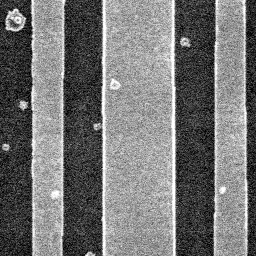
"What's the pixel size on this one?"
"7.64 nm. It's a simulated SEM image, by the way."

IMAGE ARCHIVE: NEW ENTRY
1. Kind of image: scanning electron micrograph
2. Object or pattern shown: lines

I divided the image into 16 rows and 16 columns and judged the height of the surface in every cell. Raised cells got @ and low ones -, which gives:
--@@--@@@@@---@-
--@@---@@@@---@-
--@@---@@@@--@@-
--@@--@@@@@--@@-
--@@--@@@@@--@@-
--@@--@@@@@--@@-
--@@--@@@@@--@@-
--@@--@@@@@--@@-
--@@--@@@@@--@@-
--@@---@@@@--@@-
--@@--@@@@@--@@-
--@@--@@@@@--@@-
--@@--@@@@@--@@-
--@@--@@@@@--@@-
--@@--@@@@@--@@-
--@@--@@@@@--@@-